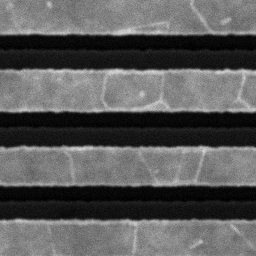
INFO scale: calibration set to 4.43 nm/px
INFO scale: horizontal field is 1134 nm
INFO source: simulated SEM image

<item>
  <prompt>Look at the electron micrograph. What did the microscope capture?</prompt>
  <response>lines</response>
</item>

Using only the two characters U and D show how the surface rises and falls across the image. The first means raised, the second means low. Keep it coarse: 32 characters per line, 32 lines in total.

UUUUUUUUUUUUUUUUUUUUUUUUUUUUUUUU
UUUUUUUUUUUUUUUUUUUUUUUUUUUUUUUU
UUUUUUUUUUUUUUUUUUUUUUUUUUUUUUUU
UUUUUUUUUUUUUUUUUUUUUUUUUUUUUUUU
DDDDDDDDDDDDDDDDDDDDDDDDDDDDDDDD
DDDDDDDDDDDDDDDDDDDDDDDDDDDDDDDD
DDDDDDDDDDDDDDDDDDDDDDDDDDDDDDDD
DDDDDDDDDDDDDDDDDDDDDDDDDDDDDDDD
DDDDDDDDDDDDDDDDDDDDDDDDDDDDDDDD
UUUUUUUUUUUUUUUUUUUUUUUUUUUUUUUU
UUUUUUUUUUUUUUUUUUUUUUUUUUUUUUUU
UUUUUUUUUUUUUUUUUUUUUUUUUUUUUUUU
UUUUUUUUUUUUUUUUUUUUUUUUUUUUUUUU
UUUUUUUUUUUUUUUUUUUUUUUUUUUUUUUU
DDDDDDDDDDDDDDDDDDDDDDDDDDDDDDDD
DDDDDDDDDDDDDDDDDDDDDDDDDDDDDDDD
DDDDDDDDDDDDDDDDDDDDDDDDDDDDDDDD
DDDDDDDDDDDDDDDDDDDDDDDDDDDDDDDD
UDUUUUUUUUUUUUUUUUUUUDUUUUUUUUUU
UUUUUUUUUUUUUUUUUUUUUUUUUUUUUUUU
UUUUUUUUUUUUUUUUUUUUUUUUUUUUUUUU
UUUUUUUUUUUUUUUUUUUUUUUUUUUUUUUU
UUUUUUUUUUUUUUUUUUUUUUUUUUUUUUUU
DDDDDDDDDDDDDDDDDDDDDDDDDDDDDDDD
DDDDDDDDDDDDDDDDDDDDDDDDDDDDDDDD
DDDDDDDDDDDDDDDDDDDDDDDDDDDDDDDD
DDDDDDDDDDDDDDDDDDDDDDDDDDDDDDDD
DDUDDDDDDUDUDDDDDDDDDDDDUDDDDDDD
UUUUUUUUUUUUUUUUUUUUUUUUUUUUUUUU
UUUUUUUUUUUUUUUUUUUUUUUUUUUUUUUU
UUUUUUUUUUUUUUUUUUUUUUUUUUUUUUUU
UUUUUUUUUUUUUUUUUUUUUUUUUUUUUUUU